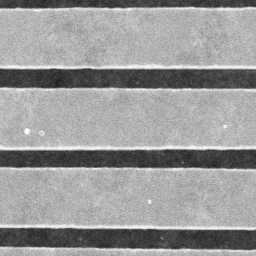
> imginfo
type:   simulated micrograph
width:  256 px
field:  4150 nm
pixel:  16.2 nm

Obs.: lines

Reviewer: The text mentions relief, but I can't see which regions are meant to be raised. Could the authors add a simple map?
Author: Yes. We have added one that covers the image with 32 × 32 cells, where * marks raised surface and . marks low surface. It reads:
................................
********************************
********************************
********************************
********************************
********************************
********************************
********************************
********************************
................................
................................
********************************
********************************
********************************
********************************
********************************
********************************
********************************
********************************
................................
................................
********************************
********************************
********************************
********************************
********************************
********************************
********************************
......**.***********************
................................
................................
********************************